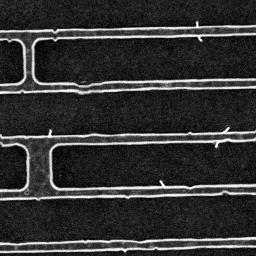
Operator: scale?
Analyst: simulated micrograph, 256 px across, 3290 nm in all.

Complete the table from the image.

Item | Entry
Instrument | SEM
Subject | parallel lines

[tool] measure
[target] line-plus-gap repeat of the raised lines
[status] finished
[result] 53.1 pixels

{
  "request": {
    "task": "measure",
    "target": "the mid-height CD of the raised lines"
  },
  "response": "0.109 um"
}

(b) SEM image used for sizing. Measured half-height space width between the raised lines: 568 nanometers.